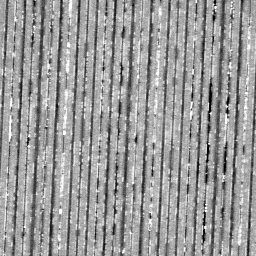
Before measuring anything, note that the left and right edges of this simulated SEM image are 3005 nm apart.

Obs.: parallel lines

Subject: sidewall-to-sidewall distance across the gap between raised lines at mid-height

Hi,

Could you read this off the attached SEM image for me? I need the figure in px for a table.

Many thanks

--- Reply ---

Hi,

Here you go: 2.62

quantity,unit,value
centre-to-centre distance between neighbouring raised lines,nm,105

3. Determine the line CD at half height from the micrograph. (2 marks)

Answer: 82.1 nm